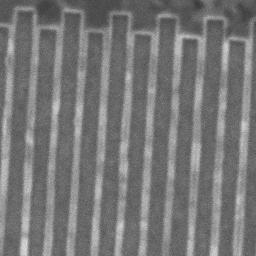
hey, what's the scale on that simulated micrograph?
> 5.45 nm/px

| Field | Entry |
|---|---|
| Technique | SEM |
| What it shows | parallel lines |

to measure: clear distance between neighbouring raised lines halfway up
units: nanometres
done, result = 99.2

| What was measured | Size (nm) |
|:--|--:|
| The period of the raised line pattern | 129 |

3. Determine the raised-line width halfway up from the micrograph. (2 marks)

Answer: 30.6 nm